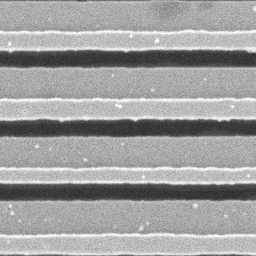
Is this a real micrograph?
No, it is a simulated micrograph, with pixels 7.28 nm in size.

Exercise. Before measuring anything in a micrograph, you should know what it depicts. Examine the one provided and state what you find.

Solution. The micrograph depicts lines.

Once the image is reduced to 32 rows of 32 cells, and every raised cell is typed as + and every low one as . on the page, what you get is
++++++++++++++++++++++++++++++++
++++++++++++++++++++++++++++++++
++++++++++++++++++++++++++++++++
++++++++++++++++++++++++++++++++
++++++++++++++++++++++++++++++++
++++++++++++++++++++++++++++++++
................................
................................
++++++++++++++++++++++++++++++++
++++++++++++++++++++++++++++++++
++++++++++++++++++++++++++++++++
++++++++++++++++++++++++++++++++
++++++++++++++++++++++++++++++++
++++++++++++++++++++++++++++++++
++++++++++++++++++++++++++++++++
................................
................................
++++++++++++++++++++++++++++++++
++++++++++++++++++++++++++++++++
++++++++++++++++++++++++++++++++
++++++++++++++++++++++++++++++++
++++++++++++++++++++++++++++++++
++++++++++++++++++++++++++++++++
................................
................................
++++++++++++++++++++++++++++++++
++++++++++++++++++++++++++++++++
++++++++++++++++++++++++++++++++
++++++++++++++++++++++++++++++++
++++++++++++++++++++++++++++++++
++++++++++++++++++++++++++++++++
++++++++++++++++++++++++++++++++